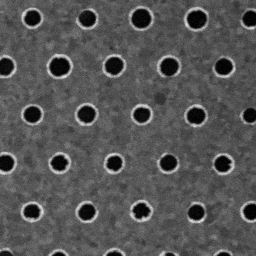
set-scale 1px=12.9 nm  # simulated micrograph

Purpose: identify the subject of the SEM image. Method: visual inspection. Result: a regular array of holes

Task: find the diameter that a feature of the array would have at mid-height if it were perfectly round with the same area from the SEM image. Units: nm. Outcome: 223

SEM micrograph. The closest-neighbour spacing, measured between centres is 699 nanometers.